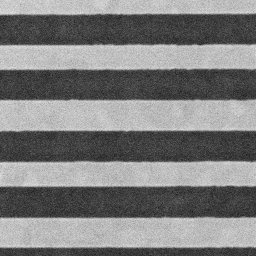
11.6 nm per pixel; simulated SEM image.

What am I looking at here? lines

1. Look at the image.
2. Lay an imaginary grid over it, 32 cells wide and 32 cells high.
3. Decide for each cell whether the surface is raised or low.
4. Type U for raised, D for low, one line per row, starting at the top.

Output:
UUUUUUUUUUUUUUUUUUUUUUUUUUUUUUUU
UUUUUUUUUUUUUUUUUUUUUUUUUUUUUUUU
DDDDDDDDDDDDDDDDDDDDDDDDDDDDDDDD
DDDDDDDDDDDDDDDDDDDDDDDDDDDDDDDD
DDDDDDDDDDDDDDDDDDDDDDDDDDDDDDDD
DDDDDDDDDDDDDDDDDDDDDDDDDDDDDDDD
UUUUUUUUUUUUUUUUUUUUUUUUUUUUUUUU
UUUUUUUUUUUUUUUUUUUUUUUUUUUUUUUU
UUUUUUUUUUUUUUUUUUUUUUUUUUUUUUUU
DDDDDDDDDDDDDDDDDDDDDDDDDDDDDDDD
DDDDDDDDDDDDDDDDDDDDDDDDDDDDDDDD
DDDDDDDDDDDDDDDDDDDDDDDDDDDDDDDD
DDDDDDDDDDDDDDDDDDDDDDDDDDDDDDDD
UUUUUUUUUUUUUUUUUUUUUUUUUUUUUUUU
UUUUUUUUUUUUUUUUUUUUUUUUUUUUUUUU
UUUUUUUUUUUUUUUUUUUUUUUUUUUUUUUU
DDDDDDDDDDDDDDDDDDDDDDDDDDDDDDDD
DDDDDDDDDDDDDDDDDDDDDDDDDDDDDDDD
DDDDDDDDDDDDDDDDDDDDDDDDDDDDDDDD
DDDDDDDDDDDDDDDDDDDDDDDDDDDDDDDD
UUUUUUUUUUUUUUUUUUUUUUUUUUUUUUUU
UUUUUUUUUUUUUUUUUUUUUUUUUUUUUUUU
UUUUUUUUUUUUUUUUUUUUUUUUUUUUUUUU
DDDDDDDDDDDDDDDDDDDDDDDDDDDDDDDD
DDDDDDDDDDDDDDDDDDDDDDDDDDDDDDDD
DDDDDDDDDDDDDDDDDDDDDDDDDDDDDDDD
DDDDDDDDDDDDDDDDDDDDDDDDDDDDDDDD
UUUUUUUUUUUUUUUUUUUUUUUUUUUUUUUU
UUUUUUUUUUUUUUUUUUUUUUUUUUUUUUUU
UUUUUUUUUUUUUUUUUUUUUUUUUUUUUUUU
UUUUUUUUUUUUUUUUUUUUUUUUUUUUUUUU
DDDDDDDDDDDDDDDDDDDDDDDDDDDDDDDD